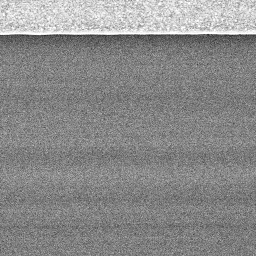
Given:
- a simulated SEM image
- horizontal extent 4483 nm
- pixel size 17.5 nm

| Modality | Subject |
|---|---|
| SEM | wiring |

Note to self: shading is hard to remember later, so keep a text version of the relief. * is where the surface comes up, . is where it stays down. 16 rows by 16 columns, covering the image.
****************
****************
................
................
................
................
................
................
................
................
................
................
................
................
................
................